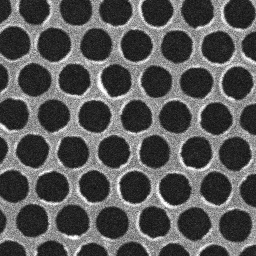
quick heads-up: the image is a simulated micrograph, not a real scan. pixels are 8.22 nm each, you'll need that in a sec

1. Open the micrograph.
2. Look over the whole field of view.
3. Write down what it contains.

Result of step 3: a regular array of holes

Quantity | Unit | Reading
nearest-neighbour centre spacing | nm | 329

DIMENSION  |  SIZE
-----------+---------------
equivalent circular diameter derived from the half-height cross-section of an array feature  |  270 nanometres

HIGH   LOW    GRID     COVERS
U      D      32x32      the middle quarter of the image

DDDDDUUUUUUDDDUUUUUUUUDDUUUUUUUU
DDDDDDUUUUDDDDDDUUUUDDDDDDUUUUUD
DDDDDDUUUDDDDDDDDUUUDDDDDDDUUDDD
DDDDDDDUUDDDDDDDDUUDDDDDDDDUUDDD
DDDDDDDUUDDDDDDDDUUDDDDDDDDUUDDD
DDDDDDDUUUDDDDDDDUUDDDDDDDDUUDDD
DDDDDDUUUUDDDDDDDUUUDDDDDDDUUDDD
UDDDDUUUUUUDDDDUUUUUDDDDDDUUUUDD
UUUUUUUUUUUUDUUUUUUUUUUUUUUUUUUU
UUUUUDDDDDUUUUUUDDDDUUUUUUDDDDUU
DUUUDDDDDDDUUUUDDDDDDUUUUDDDDDDU
DUUUDDDDDDDDUUUDDDDDDDUUDDDDDDDU
DDUDDDDDDDDDUUDDDDDDDDUUDDDDDDDD
DDUDDDDDDDDDUUDDDDDDDDUUDDDDDDDD
DUUUDDDDDDDDUUDDDDDDDDUUDDDDDDDD
DUUUDDDDDDDUUUUDDDDDDDUUDDDDDDDD
UUUUUDDDDDUUUUUDDDDDDUUUUDDDDDDU
UUUUUUUUUUUUUUUUUUUUUUUUUUUUDUUU
DDDDDUUUUUDDDDDUUUUUDDDDDUUUUUUU
DDDDDUUUUDDDDDDDUUUDDDDDDDUUUUDD
DDDDDDUUDDDDDDDDUUUDDDDDDDUUUUDD
DDDDDDUUDDDDDDDDDUUDDDDDDDDUUDDD
DDDDDDUUDDDDDDDDDUUDDDDDDDDUUDDD
DDDDDDUUUDDDDDDDUUUDDDDDDDUUUDDD
DDDDDDUUUDDDDDDDUUUDDDDDDDUUUUDD
DDDDDUUUUUDDDDUUUUUUDDDDDUUUUUUD
UUUUUUUDUUUUUUUUUUUUUUUUUUUUUUUU
UUUUUDDDDDUUUUUDDDDDUUUUUUDDDUUU
DUUUDDDDDDDUUUDDDDDDDUUUUDDDDDDU
DUUUDDDDDDDUUUDDDDDDDDUUDDDDDDDU
DUUUDDDDDDDDUUDDDDDDDDUUDDDDDDDD
DUUUDDDDDDDUUUDDDDDDDDUUDDDDDDDD